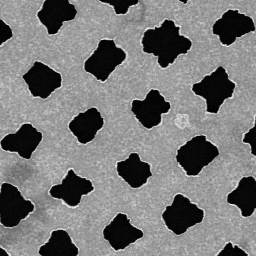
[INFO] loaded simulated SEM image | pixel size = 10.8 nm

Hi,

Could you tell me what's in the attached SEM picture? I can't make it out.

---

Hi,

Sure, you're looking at a regular array of holes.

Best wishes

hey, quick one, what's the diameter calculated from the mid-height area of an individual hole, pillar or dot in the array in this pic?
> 378 nm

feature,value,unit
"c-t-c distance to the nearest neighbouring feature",686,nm